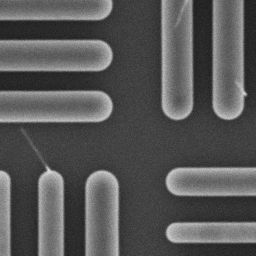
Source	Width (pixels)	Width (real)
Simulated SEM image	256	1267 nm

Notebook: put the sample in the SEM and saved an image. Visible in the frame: groups of lines, slits or small figures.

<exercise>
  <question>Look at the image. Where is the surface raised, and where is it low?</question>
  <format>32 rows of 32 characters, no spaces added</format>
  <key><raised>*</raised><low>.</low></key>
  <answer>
**************......****...***..
**************......****...***..
....................****...***..
....................****...***..
....................****...***..
*************.......****...***..
**************......****...***..
**************......****...***..
*************.......****...***..
....................****...***..
....................****...***..
....................****...****.
**************......****...***..
**************......****...***..
**************.......**....***..
................................
................................
................................
................................
................................
................................
......*.....**.......***********
*....***...****......***********
*....***...****......***********
*....***...****.................
*....***...****.................
*....***...****.................
*....***...****.................
*....***...****......***********
*....***...****......***********
*....***...****.................
*....***...****.................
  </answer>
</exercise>